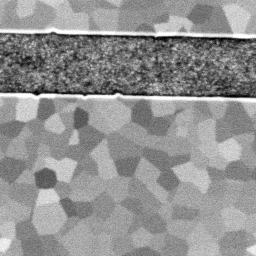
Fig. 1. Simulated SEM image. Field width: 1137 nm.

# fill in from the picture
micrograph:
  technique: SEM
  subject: one or a few lines or trenches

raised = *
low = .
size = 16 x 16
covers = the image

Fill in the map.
****************
****************
................
................
................
................
****************
****************
****************
****************
****************
****************
****************
****************
****************
****************